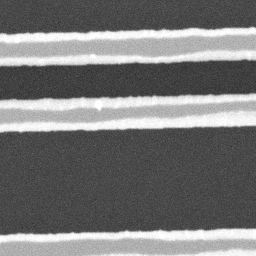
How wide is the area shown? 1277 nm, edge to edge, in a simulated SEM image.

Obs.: lines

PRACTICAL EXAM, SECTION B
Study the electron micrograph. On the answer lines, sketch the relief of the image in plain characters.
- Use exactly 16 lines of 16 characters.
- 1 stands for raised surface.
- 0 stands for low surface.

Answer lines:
0000000000000000
0000000000000000
1111111111111111
1111111111111111
0000000000000000
0000000000000000
1111111111111111
1111111111111111
0000000000000000
0000000000000000
0000000000000000
0000000000000000
0000000000000000
0000000000000000
0000000000000011
1111111111111111